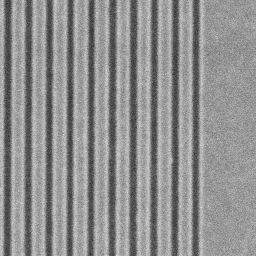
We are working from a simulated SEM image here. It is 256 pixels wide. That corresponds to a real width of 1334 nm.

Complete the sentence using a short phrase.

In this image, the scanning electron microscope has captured parallel lines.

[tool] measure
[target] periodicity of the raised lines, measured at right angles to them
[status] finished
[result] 109 nm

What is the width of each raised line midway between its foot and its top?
68.4 nm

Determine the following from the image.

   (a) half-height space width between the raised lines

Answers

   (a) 41.1 nm